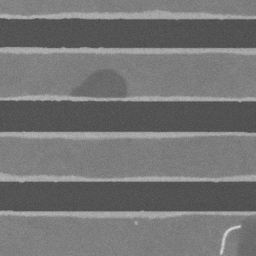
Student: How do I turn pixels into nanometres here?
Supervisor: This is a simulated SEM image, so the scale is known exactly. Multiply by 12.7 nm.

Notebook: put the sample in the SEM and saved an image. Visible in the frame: lines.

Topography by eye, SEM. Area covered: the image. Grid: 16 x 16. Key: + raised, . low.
++++++++++++++++
................
................
++++++++++++++++
++++++++++++++++
++++++++++++++++
................
................
++++++++++++++++
++++++++++++++++
++++++++++++++++
................
................
++++++++++++++++
++++++++++++++++
++++++++++++++++